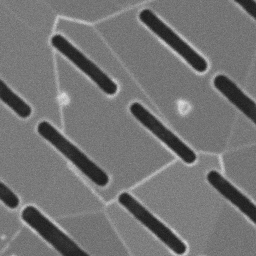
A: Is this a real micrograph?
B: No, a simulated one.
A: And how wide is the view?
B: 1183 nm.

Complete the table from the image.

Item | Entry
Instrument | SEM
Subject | holes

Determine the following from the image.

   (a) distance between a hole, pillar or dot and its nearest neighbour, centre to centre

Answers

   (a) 420 nm